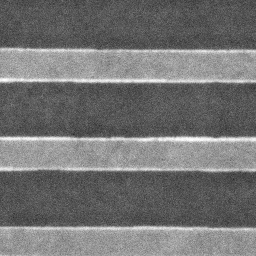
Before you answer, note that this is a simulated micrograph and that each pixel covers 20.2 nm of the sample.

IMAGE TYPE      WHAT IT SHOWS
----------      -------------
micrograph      lines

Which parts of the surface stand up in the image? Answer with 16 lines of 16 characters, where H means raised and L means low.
LLLLLLLLLLLLLLLL
LLLLLLLLLLLLLLLL
LLLLLLLLLLLLLLLL
HHHHHHHHHHHHHHHH
HHHHHHHHHHHHHHHH
LLLLLLLLLLLLLLLL
LLLLLLLLLLLLLLLL
LLLLLLLLLLLLLLLL
LLLLLLLLLLLLLLLL
HHHHHHHHHHHHHHHH
HHHHHHHHHHHHHHHH
LLLLLLLLLLLLLLLL
LLLLLLLLLLLLLLLL
LLLLLLLLLLLLLLLL
HHHHHHHHHHHHHHHH
HHHHHHHHHHHHHHHH